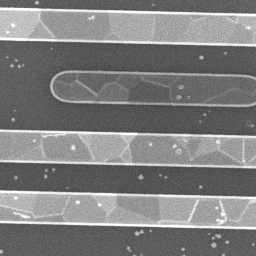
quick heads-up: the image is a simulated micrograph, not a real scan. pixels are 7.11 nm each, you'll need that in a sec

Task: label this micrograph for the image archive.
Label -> groups of lines, slits or small figures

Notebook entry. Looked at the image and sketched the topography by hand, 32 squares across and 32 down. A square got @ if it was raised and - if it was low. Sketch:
--------------------------------
@@@@@@@@@@@@@-------------------
@@@@@@@@@@@@@@@@@@@@@@@@@@@@@@@@
@@@@@@@@@@@@@@@@@@@@@@@@@@@@@@@@
@@@@@@@@@@@@@@@@@@@@@@@@@@@@@@@@
---------------------------@@@@@
--------------------------------
--------------------------------
--------------------------------
-------@@@@@@@@@@@@@@@@@@@@@@---
------@@@@@@@@@@@@@@@@@@@@@@@@@@
-------@@@@@@@@@@@@@@@@@@@@@@@@@
--------@@@@@@@@@@@@@@@@@@@@@@@@
--------------------------------
--------------------------------
--------------------------------
@@@@@@@@------------------------
@@@@@@@@@@@@@@@@@@@@@@@@@@@@@@@@
@@@@@@@@@@@@@@@@@@@@@@@@@@@@@@@@
@@@@@@@@@@@@@@@@@@@@@@@@@@@@@@@@
----------------@@@@@@@@@@@@@@@@
--------------------------------
--------------------------------
--------------------------------
@@@@@@@@@@@@@@@@@@@@@@@---------
@@@@@@@@@@@@@@@@@@@@@@@@@@@@@@@@
@@@@@@@@@@@@@@@@@@@@@@@@@@@@@@@@
@@@@@@@@@@@@@@@@@@@@@@@@@@@@@@@@
-------------------------------@
--------------------------------
--------------------------------
--------------------------------